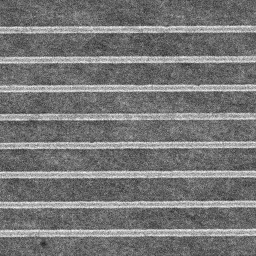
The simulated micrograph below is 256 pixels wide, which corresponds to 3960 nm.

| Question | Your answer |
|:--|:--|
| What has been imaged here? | parallel lines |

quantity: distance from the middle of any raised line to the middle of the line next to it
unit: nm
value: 450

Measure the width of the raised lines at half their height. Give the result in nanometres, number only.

87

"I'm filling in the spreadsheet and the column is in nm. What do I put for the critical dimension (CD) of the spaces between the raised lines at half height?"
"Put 364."